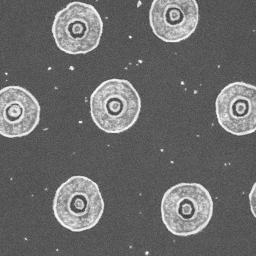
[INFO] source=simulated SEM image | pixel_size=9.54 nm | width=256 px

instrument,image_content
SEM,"ring-shaped raised bodies with a dot in the middle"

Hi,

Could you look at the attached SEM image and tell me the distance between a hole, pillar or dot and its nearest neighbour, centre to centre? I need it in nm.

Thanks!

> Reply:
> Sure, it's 908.